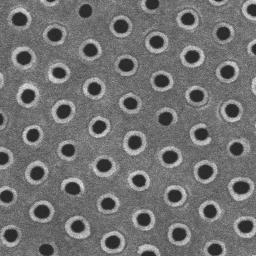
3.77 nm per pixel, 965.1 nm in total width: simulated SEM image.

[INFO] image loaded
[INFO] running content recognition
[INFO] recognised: a regular array of holes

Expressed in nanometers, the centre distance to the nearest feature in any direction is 144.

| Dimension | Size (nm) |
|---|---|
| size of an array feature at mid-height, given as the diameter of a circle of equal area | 51.1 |